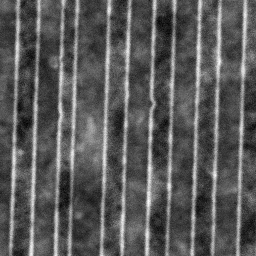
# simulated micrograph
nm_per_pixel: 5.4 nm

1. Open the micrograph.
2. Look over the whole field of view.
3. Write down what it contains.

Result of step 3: parallel lines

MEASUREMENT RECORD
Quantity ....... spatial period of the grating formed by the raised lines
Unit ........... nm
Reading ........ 245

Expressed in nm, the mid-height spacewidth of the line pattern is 128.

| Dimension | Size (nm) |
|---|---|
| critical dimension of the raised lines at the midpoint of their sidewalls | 114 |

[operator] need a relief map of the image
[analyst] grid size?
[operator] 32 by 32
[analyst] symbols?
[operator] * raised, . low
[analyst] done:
..***...**....**...***...***...*
..***...**....**...***...**....*
..***...**....**...***...**....*
..***...**....**...***...**....*
..***...**...***...***...**....*
..***...**...***...***...**....*
..***...**...***...***...**...**
..***..**....***...***...**...**
..***...*....***...***...**...**
..***...*....***...***...**...**
..***...*....***...***...**...**
..***...*....***...**....**...**
..**....*....***...***...**...**
..**....*....***...***...**...**
..**....*....***...**....**...**
..**...**....***...**...***...**
..**...**....***...**...***...**
..**...**....***...**...***...**
..**...**....***...**...***...**
..**...**....***...**...***...**
..**...**....***...**...***...**
..**...**....***...**...***...**
..**...**....***...**...***...**
..**...**....***...**...***...**
..**...**....***...**...***...**
..**...**....**....**...***...**
..**...**....**...***...***...**
..**...**....**...***...***...**
.***...**....**...***...***...**
.***...**....**...***...***...**
.***...**....**...***...***...**
.***...**....**...***...***...**